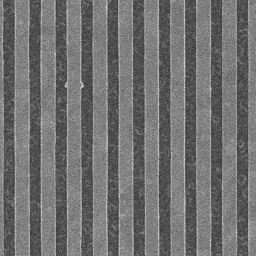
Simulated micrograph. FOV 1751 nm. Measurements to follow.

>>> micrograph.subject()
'parallel lines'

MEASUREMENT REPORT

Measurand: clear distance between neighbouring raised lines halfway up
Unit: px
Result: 11.6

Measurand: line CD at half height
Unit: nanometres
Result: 97.5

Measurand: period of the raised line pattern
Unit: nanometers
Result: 178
